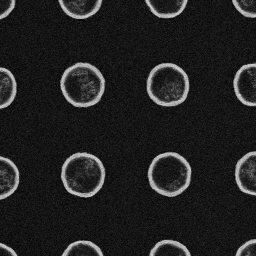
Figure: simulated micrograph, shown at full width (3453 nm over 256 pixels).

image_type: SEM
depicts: raised bodies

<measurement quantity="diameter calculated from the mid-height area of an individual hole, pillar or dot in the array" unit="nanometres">544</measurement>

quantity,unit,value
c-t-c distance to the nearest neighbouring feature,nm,1160